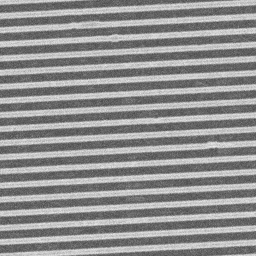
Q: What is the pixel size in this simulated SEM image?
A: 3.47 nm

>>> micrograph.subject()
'parallel lines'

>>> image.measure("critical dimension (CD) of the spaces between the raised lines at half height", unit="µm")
0.032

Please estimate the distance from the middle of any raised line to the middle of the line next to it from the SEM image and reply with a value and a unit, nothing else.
48.9 nanometres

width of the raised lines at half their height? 17.7 nm